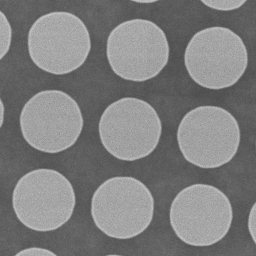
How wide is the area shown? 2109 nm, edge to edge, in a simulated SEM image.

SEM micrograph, an array of small figures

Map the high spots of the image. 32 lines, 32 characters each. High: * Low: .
..........................****..
................................
*....*****.......*..............
*...*******...******......**....
*...*******...*******...******..
*...*******..********...******..
*...*******..********..********.
....*******...*******..********.
.....*****....******...********.
...............****.....******..
.........................****...
.....***........................
....*****......***..............
...*******...******......***....
...*******...*******...******...
...*******..********...*******..
...*******..********..********..
...*******...*******..********..
....****.....******...********..
..............****.....******...
........................****....
....***.........................
..******......***...............
..*******...******.....****.....
..*******...*******...******....
..*******..********...*******...
..*******..********..********..*
..******....*******..********..*
....***.....******....*******..*
..............***.....******...*
........................**......
..****..........................